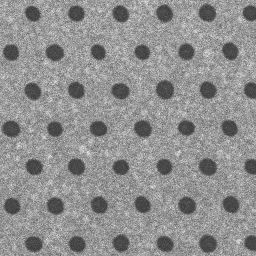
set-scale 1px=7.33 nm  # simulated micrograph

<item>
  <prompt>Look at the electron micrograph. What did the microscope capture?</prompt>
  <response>a regular array of holes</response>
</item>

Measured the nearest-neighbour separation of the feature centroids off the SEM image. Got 318 nm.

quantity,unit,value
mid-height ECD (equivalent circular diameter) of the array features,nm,125